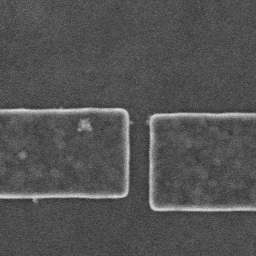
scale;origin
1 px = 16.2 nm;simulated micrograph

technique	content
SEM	wiring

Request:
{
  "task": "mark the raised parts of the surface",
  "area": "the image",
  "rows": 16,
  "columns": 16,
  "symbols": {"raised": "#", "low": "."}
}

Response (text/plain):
................
................
................
................
................
................
................
########.#######
########.#######
########.#######
########.#######
########.#######
.........#######
................
................
................